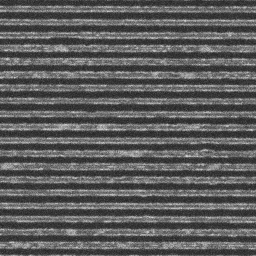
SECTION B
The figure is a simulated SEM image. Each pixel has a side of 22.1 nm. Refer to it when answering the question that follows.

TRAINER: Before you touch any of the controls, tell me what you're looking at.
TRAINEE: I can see parallel lines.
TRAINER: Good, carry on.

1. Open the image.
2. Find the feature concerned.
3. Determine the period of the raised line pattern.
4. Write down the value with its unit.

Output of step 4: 289 nm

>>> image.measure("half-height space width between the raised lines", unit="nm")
80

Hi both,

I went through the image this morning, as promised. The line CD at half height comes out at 196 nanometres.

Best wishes